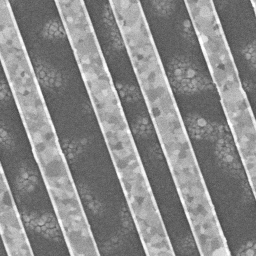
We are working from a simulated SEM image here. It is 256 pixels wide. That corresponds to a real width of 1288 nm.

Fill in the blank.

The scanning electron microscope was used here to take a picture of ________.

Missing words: one or a few lines or trenches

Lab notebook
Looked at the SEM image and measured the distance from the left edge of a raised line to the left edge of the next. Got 0.311 um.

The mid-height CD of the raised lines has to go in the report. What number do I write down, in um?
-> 0.129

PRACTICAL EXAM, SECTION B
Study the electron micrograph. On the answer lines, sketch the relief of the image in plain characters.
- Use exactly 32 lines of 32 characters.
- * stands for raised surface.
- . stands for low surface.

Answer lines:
*......***....***......****.....
*......****...****......***.....
**......***....***......***.....
**......***....***......****....
***......***...****......***....
***......***....***......***....
***......****...****.....****...
****......***...****......***...
.***......***....***......***...
.***......****...****......***..
.****......***....***......***..
..***......****...***......***..
..***......****...****......***.
..****......***....***......***.
...***......***....****.....****
...***.......***...****......***
...****......***....***......***
....***......****...****.....***
....***.......***...****......**
....****......***....***......**
.....***......****...****......*
.....****......***...****......*
*.....***......***....***......*
*.....***......****...****.....*
*.....****......***....***......
**.....***......***....***......
**.....***......****...****.....
**.....****......***....***.....
***.....***......***....****....
***.....***.......***...****....
.***....****......***....***....
.***.....***......****...****...